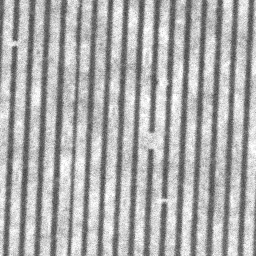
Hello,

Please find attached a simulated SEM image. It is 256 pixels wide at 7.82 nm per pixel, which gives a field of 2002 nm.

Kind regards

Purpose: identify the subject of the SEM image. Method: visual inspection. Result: parallel lines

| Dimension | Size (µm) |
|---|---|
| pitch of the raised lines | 0.122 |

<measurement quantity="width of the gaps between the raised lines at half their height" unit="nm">53.7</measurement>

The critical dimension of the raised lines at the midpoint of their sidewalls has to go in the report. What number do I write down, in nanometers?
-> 69.4